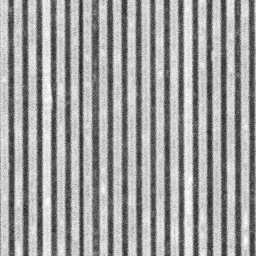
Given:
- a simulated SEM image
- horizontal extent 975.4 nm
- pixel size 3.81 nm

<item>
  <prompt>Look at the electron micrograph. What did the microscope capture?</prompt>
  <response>parallel lines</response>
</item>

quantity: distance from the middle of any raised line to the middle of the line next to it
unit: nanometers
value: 54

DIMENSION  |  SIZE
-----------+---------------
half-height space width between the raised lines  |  26.7 nanometers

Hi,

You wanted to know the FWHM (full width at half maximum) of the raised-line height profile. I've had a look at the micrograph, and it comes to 26.7 nm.